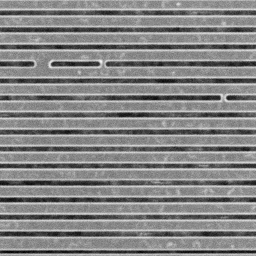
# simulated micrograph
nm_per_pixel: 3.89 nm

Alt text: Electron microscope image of parallel lines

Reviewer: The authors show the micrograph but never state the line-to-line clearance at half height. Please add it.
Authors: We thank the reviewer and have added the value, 23.4 nm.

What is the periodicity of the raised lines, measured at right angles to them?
66.5 nm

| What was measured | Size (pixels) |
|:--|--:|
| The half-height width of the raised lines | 11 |